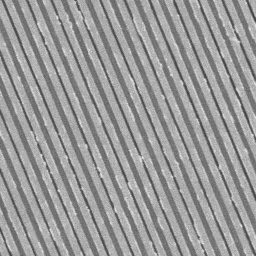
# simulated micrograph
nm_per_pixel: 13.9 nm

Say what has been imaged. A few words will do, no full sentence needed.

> parallel lines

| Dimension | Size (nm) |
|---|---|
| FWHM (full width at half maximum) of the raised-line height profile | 92.8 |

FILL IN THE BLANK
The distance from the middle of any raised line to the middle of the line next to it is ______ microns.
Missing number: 0.156